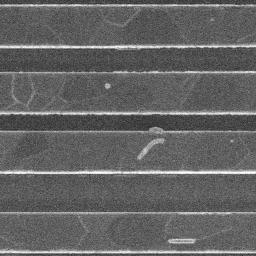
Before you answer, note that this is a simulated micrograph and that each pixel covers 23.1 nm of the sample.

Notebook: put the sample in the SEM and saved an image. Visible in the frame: lines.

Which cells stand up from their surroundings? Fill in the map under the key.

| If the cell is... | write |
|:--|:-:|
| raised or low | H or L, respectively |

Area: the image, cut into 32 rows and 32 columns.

LLLLLLLLLLLLLLLLLLLLLLLLLLLLLLLL
HHHHHHHHHHHHHHHHHHHHHHHHHHHHHHHH
HHHHHHHHHHHHHHHHHHHHHHHHHHHHHHHH
HHHHHHHHHHHHHHHHHHHHHHHHHHHHHHHH
HHHHHHHHHHHHHHHHHHHHHHHHHHHHHHHH
HHHHHHHHHHHHHHHHHHHHHHHHHHHHHHHH
LLLLLLLLLLLLLLLLLLLLLLLLLLLLLLLL
LLLLLLLLLLLLLLLLLLLLLLLLLLLLLLLL
LLLLLLLLLLLLLLLLLLLLLLLLLLLLLLLL
HHHHHHHHHHHHHHHHHHHHHHHHHHHHHHHH
HHHHHHHHHHHHHHHHHHHHHHHHHHHHHHHH
HHHHHHHHHHHHHHHHHHHHHHHHHHHHHHHH
HHHHHHHHHHHHHHHHHHHHHHHHHHHHHHHH
HHHHHHHHHHHHHHHHHHHHHHHHHHHHHHHH
LLLLLLLLLLLLLLLLLLLLLLLLLLLLLLLL
LLLLLLLLLLLLLLLLLLLLLLLLLLLLLLLL
HHHHHHHHHHHHHHHHHHHHHHHHHHHHHHHH
HHHHHHHHHHHHHHHHHHHHHHHHHHHHHHHH
HHHHHHHHHHHHHHHHHHHHHHHHHHHHHHHH
HHHHHHHHHHHHHHHHHHHHHHHHHHHHHHHH
HHHHHHHHHHHHHHHHHHHHHHHHHHHHHHHH
HHHHHHHHHHHHHHHHHHHHHHHHHHHHHHHL
LLLLLLLLLLLLLLLLLLLLLLLLLLLLLLLL
LLLLLLLLLLLLLLLLLLLLLLLLLLLLLLLL
LLLLLLLLLLLLLLLLLLLLLLLLLLLLLLLL
LLLLLLLLLLLLLLLLLLLLLLLLLLLLLLLL
LLLLLLLLLLLLLLLLLLLLLLLLLLLLLLLL
HHHHHHHHHHHHHHHHHHHHHHHHHHHHHHHH
HHHHHHHHHHHHHHHHHHHHHHHHHHHHHHHH
HHHHHHHHHHHHHHHHHHHHHHHHHHHHHHHH
HHHHHHHHHHHHHHHHHHHHHHHHHHHHHHHH
HHHHHHHHHHHHHHHHHHHHHHHHHHHHHHHH